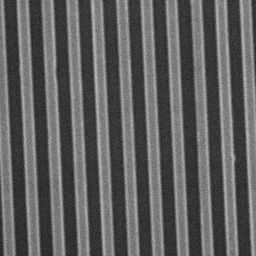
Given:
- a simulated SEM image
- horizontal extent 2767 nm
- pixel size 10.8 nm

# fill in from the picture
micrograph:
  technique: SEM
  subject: parallel lines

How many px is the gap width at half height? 15.1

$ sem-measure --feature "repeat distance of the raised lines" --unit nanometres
267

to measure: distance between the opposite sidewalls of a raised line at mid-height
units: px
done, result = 9.74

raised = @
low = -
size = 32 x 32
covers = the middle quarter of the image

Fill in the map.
--@@----@@----@@----@@@----@@---
--@@----@@----@@----@@@----@@---
--@@----@@----@@----@@@----@@---
--@@----@@----@@----@@@----@@---
--@@----@@----@@----@@@----@@---
--@@----@@----@@@----@@----@@---
--@@----@@----@@@----@@----@@---
--@@----@@----@@@----@@----@@---
--@@----@@----@@@----@@----@@---
--@@----@@----@@@----@@----@@---
--@@----@@@----@@----@@----@@---
--@@----@@@----@@----@@----@@---
--@@----@@@----@@----@@----@@---
--@@----@@@----@@----@@----@@---
--@@----@@@----@@----@@----@@---
--@@@----@@----@@----@@----@@---
--@@@----@@----@@----@@----@@---
--@@@----@@----@@----@@----@@@--
--@@@----@@----@@----@@----@@@--
--@@@----@@----@@----@@----@@@--
---@@----@@----@@----@@----@@@--
---@@----@@----@@----@@----@@@--
---@@----@@----@@----@@@----@@--
---@@----@@----@@----@@@----@@--
---@@----@@----@@----@@@----@@--
---@@----@@----@@----@@@----@@--
---@@----@@----@@----@@@----@@--
---@@----@@----@@@----@@----@@--
---@@----@@----@@@----@@----@@--
---@@----@@----@@@----@@----@@--
---@@----@@----@@@----@@----@@--
---@@----@@----@@@----@@----@@--